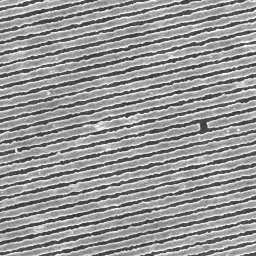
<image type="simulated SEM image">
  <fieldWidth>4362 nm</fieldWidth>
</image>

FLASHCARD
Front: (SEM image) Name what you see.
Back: parallel lines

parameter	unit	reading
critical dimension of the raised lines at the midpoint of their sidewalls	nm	127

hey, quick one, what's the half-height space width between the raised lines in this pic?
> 62.5 nm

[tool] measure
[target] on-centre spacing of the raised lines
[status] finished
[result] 186 nanometers